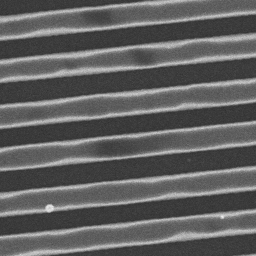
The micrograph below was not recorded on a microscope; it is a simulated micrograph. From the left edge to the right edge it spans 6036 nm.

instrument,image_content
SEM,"lines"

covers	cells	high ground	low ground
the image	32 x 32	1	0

00000000000000011111111111111111
00000111111111111111111111111111
11111111111111111111111100000000
11111111111111100000000000000000
11110000000000000000000000000111
00000000000000000011111111111111
00000000001111111111111111111111
01111111111111111111111111100000
11111111111111111110000000000000
11111111000000000000000000000000
00000000000000000000000001111111
00000000000000001111111111111111
00000001111111111111111111111111
11111111111111111111111100000000
11111111111111100000000000000000
11111000000000000000000000001111
00000000000000000001111111111111
00000000001111111111111111111111
11111111111111111111111111110000
11111111111111111100000000000000
11111111000000000000000000000000
00000000000000000000000001111111
00000000000000000111111111111111
00000011111111111111111111111111
11111111111111111111111110000000
11111111111111110000000000000000
11111100000000000000000000000111
00000000000000000001111111111111
00000000001111111111111111111111
11111111111111111111111111110000
11111111111111111110000000000000
11111111100000000000000000000000